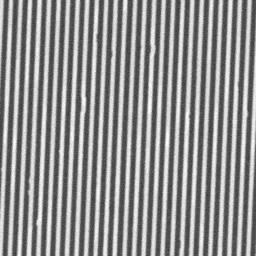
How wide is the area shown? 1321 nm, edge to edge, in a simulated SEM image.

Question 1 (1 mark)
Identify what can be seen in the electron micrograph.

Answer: parallel lines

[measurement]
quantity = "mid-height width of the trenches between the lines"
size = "30.3 nanometers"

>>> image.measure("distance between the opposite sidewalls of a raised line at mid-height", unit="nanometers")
21.3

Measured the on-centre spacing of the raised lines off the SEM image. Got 49.2 nanometers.